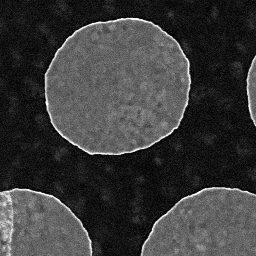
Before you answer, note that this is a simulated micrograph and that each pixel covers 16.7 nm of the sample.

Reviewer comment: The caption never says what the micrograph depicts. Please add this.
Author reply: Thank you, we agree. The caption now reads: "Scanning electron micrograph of raised bodies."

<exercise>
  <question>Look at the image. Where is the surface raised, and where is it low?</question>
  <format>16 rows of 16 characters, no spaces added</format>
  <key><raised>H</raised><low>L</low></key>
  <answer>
LLLLLLLLLLLLLLLL
LLLLLLHHHHLLLLLL
LLLLHHHHHHHLLLLL
LLLHHHHHHHHHLLLL
LLLHHHHHHHHHLLLL
LLLHHHHHHHHHLLLH
LLLHHHHHHHHHLLLL
LLLHHHHHHHHLLLLL
LLLLHHHHHHLLLLLL
LLLLLHHHLLLLLLLL
LLLLLLLLLLLLLLLL
LLLLLLLLLLLLLLLL
HHHHLLLLLLLHHHHH
HHHHHLLLLLHHHHHH
HHHHHLLLLHHHHHHH
HHHHHHLLLHHHHHHH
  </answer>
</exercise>